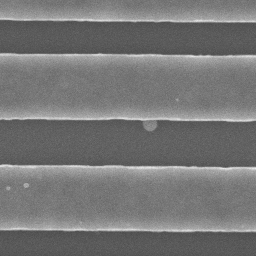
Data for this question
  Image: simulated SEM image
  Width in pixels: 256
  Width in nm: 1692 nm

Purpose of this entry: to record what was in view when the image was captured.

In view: lines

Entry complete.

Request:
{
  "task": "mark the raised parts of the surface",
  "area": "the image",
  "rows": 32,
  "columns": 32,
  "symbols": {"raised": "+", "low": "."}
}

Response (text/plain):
++++++++++++++++++++++++++++++++
++++++++++++++++++++++++++++++++
..++++++++++++++++++++++++++++++
................................
................................
................................
................................
++++++++++++++++++++++++++++++++
++++++++++++++++++++++++++++++++
++++++++++++++++++++++++++++++++
++++++++++++++++++++++++++++++++
++++++++++++++++++++++++++++++++
++++++++++++++++++++++++++++++++
++++++++++++++++++++++++++++++++
++++++++++++++++++++++++++++++++
................................
................................
................................
................................
................................
................................
++++++++++++++++++++++++++++++++
++++++++++++++++++++++++++++++++
++++++++++++++++++++++++++++++++
++++++++++++++++++++++++++++++++
++++++++++++++++++++++++++++++++
++++++++++++++++++++++++++++++++
++++++++++++++++++++++++++++++++
++++++++++++++++++++++++++++++++
................................
................................
................................